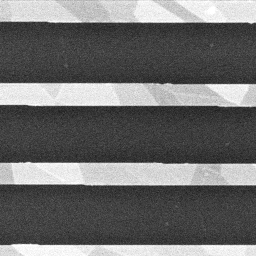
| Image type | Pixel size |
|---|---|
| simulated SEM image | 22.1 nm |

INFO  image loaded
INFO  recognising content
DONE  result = lines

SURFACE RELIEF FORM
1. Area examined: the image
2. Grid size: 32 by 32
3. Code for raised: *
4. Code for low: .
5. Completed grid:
********************************
********************************
********************************
................................
................................
................................
................................
................................
................................
................................
................................
********************************
********************************
................................
................................
................................
................................
................................
................................
................................
*********************..*........
********************************
********************************
................................
................................
................................
................................
................................
................................
................................
................................
********************************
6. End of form